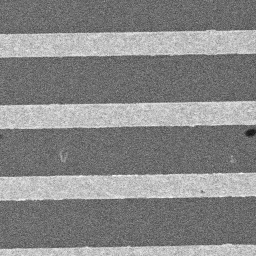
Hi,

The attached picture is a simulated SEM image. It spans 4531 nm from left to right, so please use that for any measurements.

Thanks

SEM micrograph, one or a few lines or trenches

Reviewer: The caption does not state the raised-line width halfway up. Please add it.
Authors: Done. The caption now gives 392 nm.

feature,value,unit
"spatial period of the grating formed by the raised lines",1260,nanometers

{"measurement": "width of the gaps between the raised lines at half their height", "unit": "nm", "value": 869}